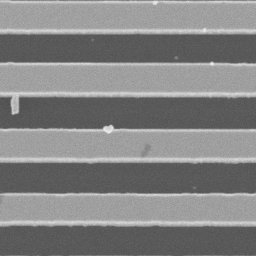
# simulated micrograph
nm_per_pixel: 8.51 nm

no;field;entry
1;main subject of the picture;lines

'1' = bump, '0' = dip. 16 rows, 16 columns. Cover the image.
1111111111111111
1111111111111111
0000000000000000
0000000000000000
1111111111111111
1111111111111111
0000000000000000
0000000000000000
1111111111111111
1111111111111111
0000000000000000
0000000000000000
1111111111111111
1111111111111111
0000000000000000
0000000000000000